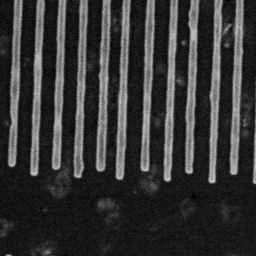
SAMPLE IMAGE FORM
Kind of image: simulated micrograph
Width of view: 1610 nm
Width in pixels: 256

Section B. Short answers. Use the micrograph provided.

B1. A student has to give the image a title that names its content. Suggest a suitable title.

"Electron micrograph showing parallel lines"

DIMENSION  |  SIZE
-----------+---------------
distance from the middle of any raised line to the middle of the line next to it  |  0.139 µm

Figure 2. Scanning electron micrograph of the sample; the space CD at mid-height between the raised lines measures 0.0959 microns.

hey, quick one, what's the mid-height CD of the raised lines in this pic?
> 45.6 nm